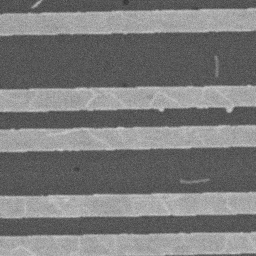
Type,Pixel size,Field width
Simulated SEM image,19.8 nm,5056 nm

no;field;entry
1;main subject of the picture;lines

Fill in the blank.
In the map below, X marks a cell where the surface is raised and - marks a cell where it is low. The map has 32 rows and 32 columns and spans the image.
--------------------------------
--------------XXXXXXXXXXXXXXXXXX
XXXXXXXXXXXXXXXXXXXXXXXXXXXXXXXX
XXXXXXXXXXXXXXXXXXXXXXXXXXXXXXXX
--------------------------------
--------------------------------
--------------------------------
--------------------------------
--------------------------------
--------------------------------
--------------------------------
XXXXXXXXXXXXXXXXXXXXXXXXXXXXXXXX
XXXXXXXXXXXXXXXXXXXXXXXXXXXXXXXX
XXXXXXXXXXXXXXXXXXXXX-------X---
--------------------------------
--------------------------------
XXXXXXXXXXXXXXXXXXXXXXXXXXXXXXXX
XXXXXXXXXXXXXXXXXXXXXXXXXXXXXXXX
XXXXXXXXXXXXXXXXXXX-X-----------
--------------------------------
--------------------------------
--------------------------------
--------------------------------
--------------------------------
------XXXXXXXXXXXXXXXXXXXXXXXXXX
XXXXXXXXXXXXXXXXXXXXXXXXXXXXXXXX
XXXXXXXXXXXXXXXXXXXXXXXXXXXXXXXX
--------------------------------
--------------------------------
----------XXXXXXXXXXXXXXXXXXXXXX
XXXXXXXXXXXXXXXXXXXXXXXXXXXXXXXX
XXXXXXXXXXXXXXXXXXXXXXXXXXXXXXXX